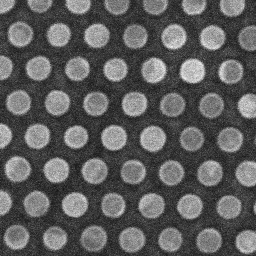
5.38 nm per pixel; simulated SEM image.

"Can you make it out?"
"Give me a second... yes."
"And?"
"a regular array of raised bodies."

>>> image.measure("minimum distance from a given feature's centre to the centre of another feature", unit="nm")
206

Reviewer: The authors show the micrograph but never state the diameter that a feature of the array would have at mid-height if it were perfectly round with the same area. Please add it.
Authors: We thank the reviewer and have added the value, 123 nm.